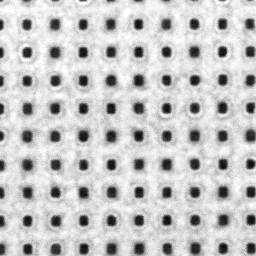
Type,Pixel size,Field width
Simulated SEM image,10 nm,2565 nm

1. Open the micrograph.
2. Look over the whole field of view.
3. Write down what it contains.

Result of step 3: a regular array of holes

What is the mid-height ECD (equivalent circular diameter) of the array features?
0.125 um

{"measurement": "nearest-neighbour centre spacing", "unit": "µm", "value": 0.277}